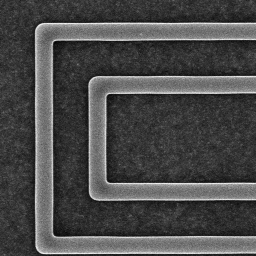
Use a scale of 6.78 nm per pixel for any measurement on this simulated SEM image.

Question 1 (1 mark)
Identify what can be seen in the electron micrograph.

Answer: groups of lines, slits or small figures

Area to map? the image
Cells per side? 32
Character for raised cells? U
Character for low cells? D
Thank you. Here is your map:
DDDDDDDDDDDDDDDDDDDDDDDDDDDDDDDD
DDDDDDDDDDDDDDDDDDDDDDDDDDDDDDDD
DDDDDDDDDDDDDDDDDDDDDDDDDDDDDDDD
DDDDDUUUUUUUUUUUUUUUUUUUUUUUUUUU
DDDDUUUUUUUUUUUUUUUUUUUUUUUUUUUU
DDDDUUUDDDDDDDDDDDDDDDDDDDDDDDDD
DDDDUUUDDDDDDDDDDDDDDDDDDDDDDDDD
DDDDUUUDDDDDDDDDDDDDDDDDDDDDDDDD
DDDDUUUDDDDDDDDDDDDDDDDDDDDDDDDD
DDDDUUUDDDDDDDDDDDDDDDDDDDDDDDDD
DDDDUUUDDDDUUUUUUUUUUUUUUUUUUUUU
DDDDUUUDDDDUUUUUUUUUUUUUUUUUUUUU
DDDDUUUDDDDUUDDDDDDDDDDDDDDDDDDD
DDDDUUUDDDDUUDDDDDDDDDDDDDDDDDDD
DDDDUUUDDDDUUDDDDDDDDDDDDDDDDDDD
DDDDUUUDDDDUUDDDDDDDDDDDDDDDDDDD
DDDDDUUDDDDUUDDDDDDDDDDDDDDDDDDD
DDDDDUUDDDDUUDDDDDDDDDDDDDDDDDDD
DDDDDUUDDDDUUDDDDDDDDDDDDDDDDDDD
DDDDDUUDDDDUUDDDDDDDDDDDDDDDDDDD
DDDDDUUDDDDUUDDDDDDDDDDDDDDDDDDD
DDDDUUUDDDDUUDDDDDDDDDDDDDDDDDDD
DDDDUUUDDDDUUDDDDDDDDDDDDDDDDDDD
DDDDUUUDDDDUUUUUUUUUUUUUUUUUUUUU
DDDDUUUDDDDUUUUUUUUUUUUUUUUUUUUU
DDDDUUUDDDDDDDDDDDDDDDDDDDDDDDDD
DDDDUUUDDDDDDDDDDDDDDDDDDDDDDDDD
DDDDUUUDDDDDDDDDDDDDDDDDDDDDDDDD
DDDDDUUDDDDDDDDDDDDDDDDDDDDDDDDD
DDDDDUUDDDDDDDDDDDDDDDDDDDDDDDDD
DDDDDUUUUUUUUUUUUUUUUUUUUUUUUUUU
DDDDDUUUUUUUUUUUUUUUUUUUUUUUUUUU